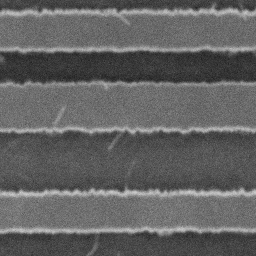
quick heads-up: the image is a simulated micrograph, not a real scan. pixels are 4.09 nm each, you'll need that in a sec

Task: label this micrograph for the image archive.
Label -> lines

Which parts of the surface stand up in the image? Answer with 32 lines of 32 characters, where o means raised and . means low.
................................
oo.ooooooooooooooooooooooooooooo
oooooooooooooooooooooooooooooooo
oooooooooooooooooooooooooooooooo
oooooooooooooooooooooooooooooooo
oooooooooooooooooooooooooooooooo
........o.......................
................................
................................
................................
oo.ooooooooooooooooooooooooooooo
oooooooooooooooooooooooooooooooo
oooooooooooooooooooooooooooooooo
oooooooooooooooooooooooooooooooo
oooooooooooooooooooooooooooooooo
oooooooooooooooooooooooooooooooo
..o........o....o........o......
................................
................................
................................
................................
................................
................................
................................
oooooooooooooooooooooooooooooooo
oooooooooooooooooooooooooooooooo
oooooooooooooooooooooooooooooooo
oooooooooooooooooooooooooooooooo
oooooooooooooooooooooooooooooooo
................................
................................
................................